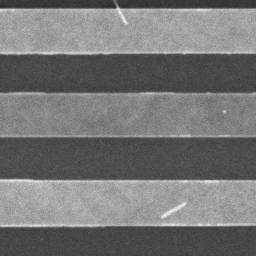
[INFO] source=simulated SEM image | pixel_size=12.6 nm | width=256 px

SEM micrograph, lines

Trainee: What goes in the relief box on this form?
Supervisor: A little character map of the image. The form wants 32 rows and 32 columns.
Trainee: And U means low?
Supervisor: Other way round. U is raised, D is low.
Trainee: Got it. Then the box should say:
DDDDDDDDDDDDDDDDDDDDDDDDDDDDDDDD
UUUUUUUUUUUUUUUUUUUUUUUUUUUUUUUU
UUUUUUUUUUUUUUUUUUUUUUUUUUUUUUUU
UUUUUUUUUUUUUUUUUUUUUUUUUUUUUUUU
UUUUUUUUUUUUUUUUUUUUUUUUUUUUUUUU
UUUUUUUUUUUUUUUUUUUUUUUUUUUUUUUU
UUUUUUUUUUUUUUUUUUUUUUUUUUUUUUUU
DDDDDDDDDDDDDDDDDDDDDDDDDDDDDDDD
DDDDDDDDDDDDDDDDDDDDDDDDDDDDDDDD
DDDDDDDDDDDDDDDDDDDDDDDDDDDDDDDD
DDDDDDDDDDDDDDDDDDDDDDDDDDDDDDDD
DDDDDDDDDDDDDDDDDDDDDDDDDDDDDDDD
UUUUUUUUUUUUUUUUUUUUUUUUUUUUUUUU
UUUUUUUUUUUUUUUUUUUUUUUUUUUUUUUU
UUUUUUUUUUUUUUUUUUUUUUUUUUUUUUUU
UUUUUUUUUUUUUUUUUUUUUUUUUUUUUUUU
UUUUUUUUUUUUUUUUUUUUUUUUUUUUUUUU
DDDDDDDDDDDDDDDDDDDDDDDDDDDDDDDD
DDDDDDDDDDDDDDDDDDDDDDDDDDDDDDDD
DDDDDDDDDDDDDDDDDDDDDDDDDDDDDDDD
DDDDDDDDDDDDDDDDDDDDDDDDDDDDDDDD
DDDDDDDDDDDDDDDDDDDDDDDDDDDDDDDD
DDDDDDDDDDDDDDDDDDDDDDDDDDDDDDDD
UUUUUUUUUUUUUUUUUUUUUUUUUUUUUUUU
UUUUUUUUUUUUUUUUUUUUUUUUUUUUUUUU
UUUUUUUUUUUUUUUUUUUUUUUUUUUUUUUU
UUUUUUUUUUUUUUUUUUUUUUUUUUUUUUUU
UUUUUUUUUUUUUUUUUUUUUUUUUUUUUUUU
DDDDDDDDDDDDDDDDDDDDDDDDDDDDDDDD
DDDDDDDDDDDDDDDDDDDDDDDDDDDDDDDD
DDDDDDDDDDDDDDDDDDDDDDDDDDDDDDDD
DDDDDDDDDDDDDDDDDDDDDDDDDDDDDDDD